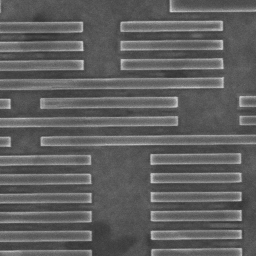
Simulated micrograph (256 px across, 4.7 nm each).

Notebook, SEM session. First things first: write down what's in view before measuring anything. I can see wiring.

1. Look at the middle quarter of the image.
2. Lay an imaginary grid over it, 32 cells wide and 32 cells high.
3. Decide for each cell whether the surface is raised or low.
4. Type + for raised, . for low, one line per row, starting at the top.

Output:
+++++.........++++++++++++++++++
................................
................................
................................
++++++++++++++++++++++++++++++++
++++++++++++++++++++++++++++++++
................................
................................
.........+++++++++++++++++++....
++++++++++++++++++++++++++++....
++++++++++++++++++++++++++++....
................................
................................
++++++++++++++++++++++++++++....
++++++++++++++++++++++++++++....
+++++++++++.....................
................................
................................
++++++++++++++++++++++++++++++++
++++++++++++++++++++++++++++++++
................................
................................
................................
+++++++...............++++++++++
+++++++...............++++++++++
................................
................................
......................++++++++++
+++++++...............++++++++++
+++++++...............++++++++++
................................
................................